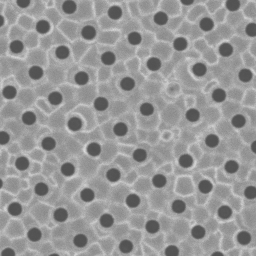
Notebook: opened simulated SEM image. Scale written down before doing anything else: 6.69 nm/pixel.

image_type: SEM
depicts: a regular array of holes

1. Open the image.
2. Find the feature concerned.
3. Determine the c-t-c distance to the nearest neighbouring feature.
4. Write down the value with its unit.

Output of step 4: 215 nanometers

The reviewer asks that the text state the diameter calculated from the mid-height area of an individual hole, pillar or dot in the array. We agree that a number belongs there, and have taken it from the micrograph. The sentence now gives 94.6 nm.